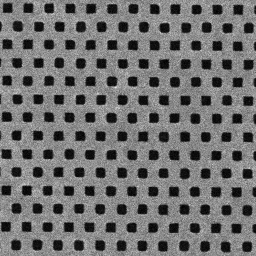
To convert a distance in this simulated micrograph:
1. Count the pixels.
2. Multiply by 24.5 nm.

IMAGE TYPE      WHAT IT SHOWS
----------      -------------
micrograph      a regular array of holes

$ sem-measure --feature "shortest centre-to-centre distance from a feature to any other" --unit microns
0.501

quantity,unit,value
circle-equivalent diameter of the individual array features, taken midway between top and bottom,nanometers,273